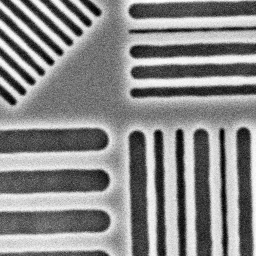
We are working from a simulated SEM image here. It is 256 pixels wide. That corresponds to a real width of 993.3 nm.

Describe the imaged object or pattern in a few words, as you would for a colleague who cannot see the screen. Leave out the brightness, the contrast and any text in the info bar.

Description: groups of lines, slits or small figures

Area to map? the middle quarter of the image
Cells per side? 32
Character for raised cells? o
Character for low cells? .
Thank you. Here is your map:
ooooooooooooooooo...............
ooooooooooooooooo...............
ooooooooooooooooo...............
ooooooooooooooooo...............
oooooooooooooooooooooooooooooooo
ooooooooooooooooooooooooooooooo.
ooooooooooooooooo...............
ooooooooooooooooo...............
oooooooooooooooooo..oooooooooooo
oooooooooooooooooooooooooooooooo
oooooooooooooooooooooooooooooooo
oooooooooooooooooooooooooooooooo
oooooooooooooooooooooooooooooooo
oooooooooooooooooooooooooooooooo
oooooooooooooooooooooooooooooooo
oooooooooooooooooooooooooooooooo
..........oooooooo.oooo.oooo..oo
...........ooooo....oo...ooo..oo
...........ooooo....oo...ooo..oo
...........ooooo.....o...ooo..oo
...........ooooo.....o...ooo..oo
..........oooooo.....o...ooo..oo
oooooooooooooooo.....o...ooo..oo
oooooooooooooooo.....o...ooo..oo
oooooooooooooooo.....o...ooo..oo
oooooooooooooooo.....o...ooo..oo
..........oooooo.....o...ooo..oo
...........ooooo.....o...ooo..oo
............oooo.....o...ooo..oo
............oooo.....o...ooo..oo
...........ooooo.....oo..ooo..oo
..........oooooo.....oo..ooo..oo